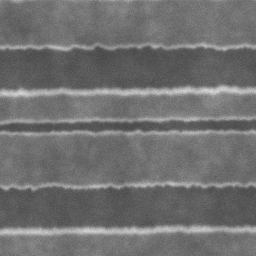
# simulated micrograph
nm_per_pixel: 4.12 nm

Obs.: lines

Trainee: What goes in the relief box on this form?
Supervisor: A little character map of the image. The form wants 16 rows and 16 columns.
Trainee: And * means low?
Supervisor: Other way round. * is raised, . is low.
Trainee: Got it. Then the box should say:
****************
****************
****************
................
................
................
****************
****************
****************
****************
****************
****************
................
................
...*************
****************